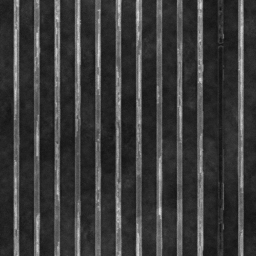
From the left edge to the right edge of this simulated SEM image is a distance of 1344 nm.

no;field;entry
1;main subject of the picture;parallel lines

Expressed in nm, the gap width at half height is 80.1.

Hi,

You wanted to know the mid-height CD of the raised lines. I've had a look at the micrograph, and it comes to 26.9 nanometers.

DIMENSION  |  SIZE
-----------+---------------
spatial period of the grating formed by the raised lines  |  107 nanometers